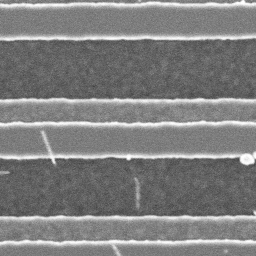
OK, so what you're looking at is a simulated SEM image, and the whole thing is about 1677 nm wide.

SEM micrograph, lines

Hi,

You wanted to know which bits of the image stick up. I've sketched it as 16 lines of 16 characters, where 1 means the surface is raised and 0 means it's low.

1111111111111111
1111111111111111
1000000000000000
0000000000000000
0000000000000000
0000000000000000
1111111111111111
1111111111111111
1111111111111111
1111111111111111
0000000000000000
0000000000000000
0000000000000000
0000000000000000
1111111111111111
1111111111111111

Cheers